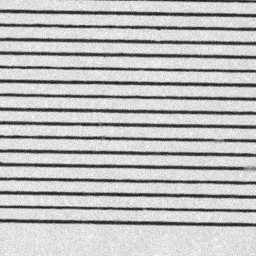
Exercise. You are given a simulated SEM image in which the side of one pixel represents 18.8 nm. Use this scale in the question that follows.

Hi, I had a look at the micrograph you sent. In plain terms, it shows parallel lines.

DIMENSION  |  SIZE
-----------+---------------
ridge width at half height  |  200 nanometres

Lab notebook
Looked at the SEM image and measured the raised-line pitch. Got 262 nm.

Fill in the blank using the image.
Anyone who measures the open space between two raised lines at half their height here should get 72.8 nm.